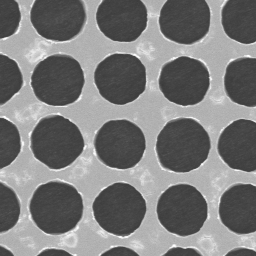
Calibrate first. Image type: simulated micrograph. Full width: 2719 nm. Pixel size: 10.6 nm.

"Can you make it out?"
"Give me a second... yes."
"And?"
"a regular array of holes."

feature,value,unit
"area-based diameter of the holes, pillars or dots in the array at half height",52.3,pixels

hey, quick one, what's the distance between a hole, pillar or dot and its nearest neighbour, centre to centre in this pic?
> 668 nanometres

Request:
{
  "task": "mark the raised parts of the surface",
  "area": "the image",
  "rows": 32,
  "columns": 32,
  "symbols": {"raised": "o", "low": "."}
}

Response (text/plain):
..oo......ooo.....ooo.....oo....
..oo.......o......oo......oo....
..oo.......o......oo......oo....
..oo......oo......oo......oo....
.oooo....oooo....oooo....oooo...
ooooooooooooooooooooooo.oooooooo
oooooooooooooooooooooooooooooooo
..ooo....oooo....ooooo...oooo...
..oo......oo......oo......oo....
...o......oo......oo......oo....
...o......oo......oo......oo....
..oo......oo......oo......oo....
.oooo....oooo....oooo....oooo...
oooooooooooooooooooooooooooooooo
oooooooooooooooooooooooooooooooo
..ooo....oooo....oooo....oooo...
..oo......oo......oo......oo....
...o......oo......oo......o.....
...o......oo......oo......o.....
..oo......oo......oo......oo....
.ooooo...oooo....ooo.....ooo....
oooooooooooooooooooooo.ooooooooo
oooooooooooooooooooooooooooooooo
.oooo....oooo....oooo...ooooo...
..oo......oo......oo.....ooo....
..oo......oo......oo......o.....
..oo......oo......oo......o.....
..oo......oo......oo......oo....
.oooo....oooo....oooo....oooo...
ooooooooooooooo.oooooooooooooooo
oooooooooooooooooooooooooooooooo
.oooo...ooooo....oooo....oooo...